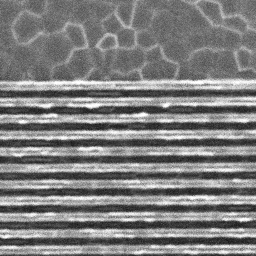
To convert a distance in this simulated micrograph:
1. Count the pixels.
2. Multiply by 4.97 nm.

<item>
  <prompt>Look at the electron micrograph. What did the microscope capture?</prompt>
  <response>parallel lines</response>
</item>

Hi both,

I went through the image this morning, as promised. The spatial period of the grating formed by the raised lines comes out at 81.7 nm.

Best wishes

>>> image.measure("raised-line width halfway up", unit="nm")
38.5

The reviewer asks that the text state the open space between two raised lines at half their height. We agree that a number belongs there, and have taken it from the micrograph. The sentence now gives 0.0435 micrometres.